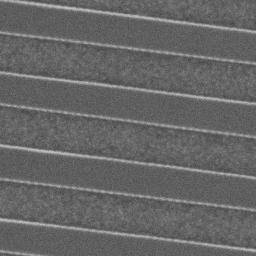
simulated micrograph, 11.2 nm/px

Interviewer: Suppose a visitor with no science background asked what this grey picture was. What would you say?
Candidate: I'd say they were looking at lines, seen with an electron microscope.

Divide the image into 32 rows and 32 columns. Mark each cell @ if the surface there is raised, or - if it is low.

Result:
@@@@@---------------------------
@@@@@@@@@@@@@-------------------
@@@@@@@@@@@@@@@@@@@@@-----------
@@@@@@@@@@@@@@@@@@@@@@@@@@@@@---
----@@@@@@@@@@@@@@@@@@@@@@@@@@@@
-----------@@@@@@@@@@@@@@@@@@@@@
-------------------@@@@@@@@@@@@@
---------------------------@@@@@
--------------------------------
@@@@----------------------------
@@@@@@@@@@@@--------------------
@@@@@@@@@@@@@@@@@@@@------------
@@@@@@@@@@@@@@@@@@@@@@@@@@@@----
---@@@@@@@@@@@@@@@@@@@@@@@@@@@@@
-----------@@@@@@@@@@@@@@@@@@@@@
-------------------@@@@@@@@@@@@@
--------------------------@@@@@@
--------------------------------
@@@-----------------------------
@@@@@@@@@@@---------------------
@@@@@@@@@@@@@@@@@@--------------
@@@@@@@@@@@@@@@@@@@@@@@@@@------
@@@@@@@@@@@@@@@@@@@@@@@@@@@@@@@@
---------@@@@@@@@@@@@@@@@@@@@@@@
-----------------@@@@@@@@@@@@@@@
-------------------------@@@@@@@
--------------------------------
@-------------------------------
@@@@@@@@@@----------------------
@@@@@@@@@@@@@@@@@@--------------
@@@@@@@@@@@@@@@@@@@@@@@@@@------
-@@@@@@@@@@@@@@@@@@@@@@@@@@@@@@@